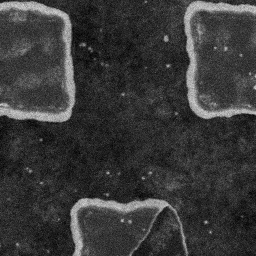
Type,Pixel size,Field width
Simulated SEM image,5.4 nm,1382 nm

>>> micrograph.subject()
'raised bodies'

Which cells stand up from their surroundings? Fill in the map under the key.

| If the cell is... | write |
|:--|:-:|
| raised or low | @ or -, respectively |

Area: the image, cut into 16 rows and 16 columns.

@@@---------@@@-
@@@@--------@@@@
@@@@--------@@@@
@@@@--------@@@@
@@@@--------@@@@
@@@@--------@@@@
@@@@@-------@@@@
----------------
----------------
----------------
----------------
----------------
----------------
-----@@@@@------
-----@@@@-------
-----@@@@-------